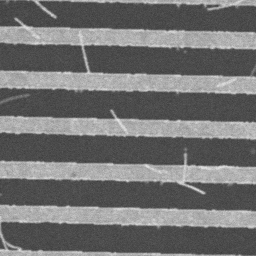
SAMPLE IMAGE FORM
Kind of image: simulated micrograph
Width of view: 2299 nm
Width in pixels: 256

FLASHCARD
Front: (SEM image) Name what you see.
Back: lines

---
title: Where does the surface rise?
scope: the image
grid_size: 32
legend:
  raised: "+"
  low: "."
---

......................++++++++++
................................
................................
++++............................
++++++++++++++++++++++++++++++++
.....+.+.+++++++++++++++++++++++
................................
................................
................................
+++++++++++++++++++++++.........
++++++++++++++++++++++++++++++++
..........................++++++
................................
................................
................................
++++++++++++++++++++++++++++++++
++++++++++++++++++++++++++++++++
................................
................................
................................
+++++++++++++++.................
++++++++++++++++++++++++++++++++
..............++++++++++++++++++
................................
................................
................................
++++++++++++++++++++++++++++++++
++++++++++++++++++++++++++++++++
................................
................................
................................
+++++++++++.....................